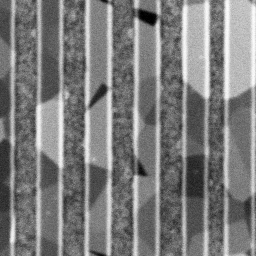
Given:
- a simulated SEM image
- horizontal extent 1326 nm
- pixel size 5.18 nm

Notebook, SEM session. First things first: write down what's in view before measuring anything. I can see parallel lines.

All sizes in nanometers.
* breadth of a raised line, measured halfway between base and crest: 118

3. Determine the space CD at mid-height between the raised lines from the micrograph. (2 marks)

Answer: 26.1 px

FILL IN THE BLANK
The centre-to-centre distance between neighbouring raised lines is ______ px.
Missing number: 47.6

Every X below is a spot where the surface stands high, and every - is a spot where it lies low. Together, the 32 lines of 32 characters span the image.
XX---XXX---XXX---XXX---XXX--XXXX
XX---XXX---XXX---XXX---XXX--XXXX
XX---XXX---XXX---XXX---XXX--XXXX
XX---XXX---XXX---XXX---XXX--XXXX
XX---XXX---XXX---XXX---XXX--XXXX
XX---XXX---XXX---XXX---XXX--XXXX
XX---XXX---XXX---XXX---XXX--XXXX
XX---XXX---XXX---XXX---XXX--XXXX
XX---XXX---XXX---XXX---XXX--XXXX
XX---XXX---XXX---XXX---XXX--XXXX
XX---XXX---XXX---XXX---XXX--XXXX
XX---XXX---XXX---XXX---XXX--XXXX
XX---XXX---XXX---XXX---XXX--XXXX
XX---XXX---XXX---XXX---XXX--XXXX
XX---XXX---XXX---XXX---XXX--XXXX
XX---XXX---XXX---XXX---XXX--XXXX
XX---XXX---XXX---XXX---XXX--XXXX
XX---XXX---XXX---XXX---XXX--XXXX
XX---XXX---XXX---XXX---XXX--XXXX
XX---XXX---XXX---XXX---XXX--XXXX
XX---XXX---XXX---XXX---XXX--XXXX
XX---XXX---XXX---XXX---XXX--XXXX
XX---XXX---XXX---XXX---XXX--XXXX
XX---XXX---XXX---XXX---XXX--XXXX
XX---XXX---XXX---XXX---XXX--XXXX
X----XXX---XXX---XXX---XXX--XXXX
X----XXX---XXX---XXX---XXX--XXXX
X----XXX---XXX---XXX---XXX--XXXX
X----XXX---XXX---XXX---XXX--XXXX
X----XXX---XXX---XXX---XXX--XXXX
X----XX----XXX---XXX---XXX--XXXX
X----XX----XXX---XXX---XXX--XXXX